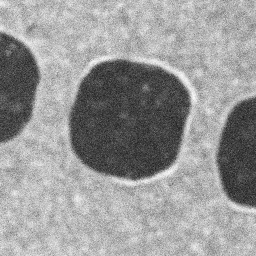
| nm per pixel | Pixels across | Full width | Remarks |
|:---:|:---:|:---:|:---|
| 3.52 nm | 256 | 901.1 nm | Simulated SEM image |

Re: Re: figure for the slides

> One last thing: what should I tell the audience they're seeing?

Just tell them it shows holes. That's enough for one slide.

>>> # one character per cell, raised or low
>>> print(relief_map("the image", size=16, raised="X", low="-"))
XXXXXXXXXXXXXXXX
XXXXXXXXXXXXXXXX
-XXXXXXXXXXXXXXX
--XXXXXXXXXXXXXX
---XX------XXXXX
--XXX-------XXXX
--XXX-------XXX-
--XX--------XX--
-XXX-------XXX--
XXXXX------XX---
XXXXX------XXX--
XXXXXXXXXXXXXX--
XXXXXXXXXXXXXX--
XXXXXXXXXXXXXXXX
XXXXXXXXXXXXXXXX
XXXXXXXXXXXXXXXX